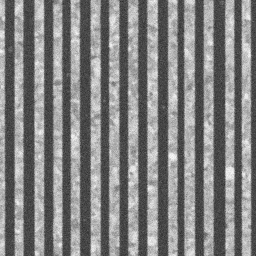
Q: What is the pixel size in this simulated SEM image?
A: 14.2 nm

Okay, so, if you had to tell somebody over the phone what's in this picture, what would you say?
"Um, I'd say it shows parallel lines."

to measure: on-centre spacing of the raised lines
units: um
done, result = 0.269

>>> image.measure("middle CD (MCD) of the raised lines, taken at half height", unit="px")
8.25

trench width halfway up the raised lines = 144 nanometers